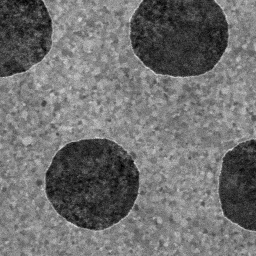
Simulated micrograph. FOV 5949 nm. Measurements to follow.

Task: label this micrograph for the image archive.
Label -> holes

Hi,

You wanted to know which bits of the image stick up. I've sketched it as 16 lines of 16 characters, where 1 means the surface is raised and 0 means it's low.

0001111110000011
0001111100000011
0001111100000011
0001111110000011
0111111111000111
1111111111111111
1111111111111111
1111111111111111
1111111111111111
1111000011111100
1110000001111100
1110000001111100
1110000001111100
1111000011111100
1111111111111111
1111111111111111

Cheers